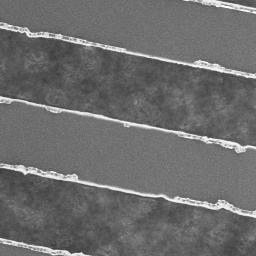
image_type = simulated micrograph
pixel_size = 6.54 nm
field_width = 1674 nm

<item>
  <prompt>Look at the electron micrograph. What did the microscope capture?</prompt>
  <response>one or a few lines or trenches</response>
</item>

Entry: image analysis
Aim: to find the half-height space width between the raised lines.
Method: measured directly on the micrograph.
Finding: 448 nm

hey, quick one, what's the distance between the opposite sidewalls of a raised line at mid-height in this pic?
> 442 nm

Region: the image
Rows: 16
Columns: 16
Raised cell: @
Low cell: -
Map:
@@@@@@@@@@@@@@@-
@@@@@@@@@@@@@@@@
----@@@@@@@@@@@@
---------@@@@@@@
--------------@@
----------------
@@--------------
@@@@@@@---------
@@@@@@@@@@@@----
@@@@@@@@@@@@@@@@
@@@@@@@@@@@@@@@@
------@@@@@@@@@@
-----------@@@@@
----------------
----------------
@@@-------------